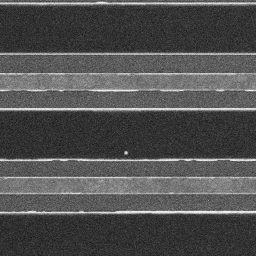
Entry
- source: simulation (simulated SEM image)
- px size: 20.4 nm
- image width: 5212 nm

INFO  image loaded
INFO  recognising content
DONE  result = lines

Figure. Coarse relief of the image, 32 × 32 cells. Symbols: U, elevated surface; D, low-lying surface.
UUUUUUUUUUUUUUUUUUUUUUUUUUUUUUUU
UUUUUUUUUUUUUUUUUUUUUUUUUUUUUUUU
UUUUUUUUUUUUUUUUUUUUUUUUUUUUUUUU
UUUUUUUUUUUUUUUUUUUUUUUUUUUUUUUU
UUUUUUUUUUUUUUUUUUUUUUUUUUUUUUUU
UUUUUUUUUUUUUUUUUUUUUUUUUUUUUUUU
UUUUUUUUUUUUUUUUUUUUUUUUUUUUUUUU
DDDDDDDDDDDDDDDDDDDDDDDDDDDDDDDD
DDDDDDDDDDDDDDDDDDDDDDDDDDDDDDDD
UUUUUUUUUUUUUUUUUUUUUUUUUUUUUUUU
UUUUUUUUUUUUUUUUUUUUUUUUUUUUUUUU
DDDDDDDDDDDDDDDDDDDDDDDDDDDDDDDD
DDDDDDDDDDDDDDDDDDDDDDDDDDDDDDDD
DDDDDDDDDDDDDDDDDDDDDDDDDDDDDDDD
UUUUUUUUUUUUUUUUUUUUUUUUUUUUUUUU
UUUUUUUUUUUUUUUUUUUUUUUUUUUUUUUU
UUUUUUUUUUUUUUUUUUUUUUUUUUUUUUUU
UUUUUUUUUUUUUUUUUUUUUUUUUUUUUUUU
UUUUUUUUUUUUUUUUUUUUUUUUUUUUUUUU
UUUUUUUUUUUUUUUUUUUUUUUUUUUUUUUU
DDDDDDDDDDDDDDDDDDDDDDDDDDDDDDDD
DDDDDDDDDDDDDDDDDDDDDDDDDDDDDDDD
UUUUUUUUUUUUUUUUUUUUUUUUUUUUUUUU
UUUUUUUUUUUUUUUUUUUUUUUUUUUUUUUU
DDDDDDDDDDDDDDDDDDDDDDDDDDDDDDDD
DDDDDDDDDDDDDDDDDDDDDDDDDDDDDDDD
DDDDDDDDDDDDDDDDDDUUDUUUDDDDDUUU
UUUUUUUUUUUUUUUUUUUUUUUUUUUUUUUU
UUUUUUUUUUUUUUUUUUUUUUUUUUUUUUUU
UUUUUUUUUUUUUUUUUUUUUUUUUUUUUUUU
UUUUUUUUUUUUUUUUUUUUUUUUUUUUUUUU
UUUUUUUUUUUUUUUUUUUUUUUUUUUUUUUU